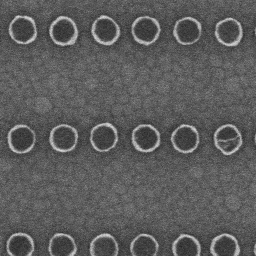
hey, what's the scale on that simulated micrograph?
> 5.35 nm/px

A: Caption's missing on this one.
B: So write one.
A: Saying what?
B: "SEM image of a regular array of raised bodies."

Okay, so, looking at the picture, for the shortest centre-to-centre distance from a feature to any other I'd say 40.4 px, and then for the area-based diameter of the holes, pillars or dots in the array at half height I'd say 0.142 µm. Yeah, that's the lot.